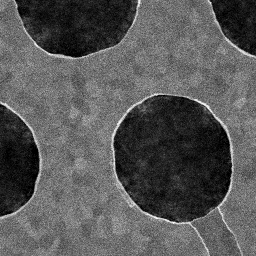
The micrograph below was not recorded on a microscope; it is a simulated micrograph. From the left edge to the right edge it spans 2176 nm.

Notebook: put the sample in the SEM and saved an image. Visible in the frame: holes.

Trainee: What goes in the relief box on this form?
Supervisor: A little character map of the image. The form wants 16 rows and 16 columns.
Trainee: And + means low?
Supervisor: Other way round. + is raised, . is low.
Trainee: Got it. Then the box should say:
+........++++...
+.......++++++..
++......++++++..
++++.+++++++++++
++++++++++++++++
++++++++++++++++
+++++++++....+++
.+++++++......++
..+++++.......++
..+++++.......++
..+++++.......++
..++++++......++
..++++++......++
++++++++++....++
++++++++++++..++
+++++++++++++..+